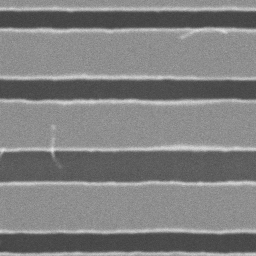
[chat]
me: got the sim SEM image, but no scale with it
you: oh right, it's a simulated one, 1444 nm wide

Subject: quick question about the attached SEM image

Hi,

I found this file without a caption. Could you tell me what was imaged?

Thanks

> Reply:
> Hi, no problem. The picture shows lines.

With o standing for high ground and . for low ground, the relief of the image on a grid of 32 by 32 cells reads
oooooooooooooooooooooooooooooooo
................................
................................
....oo.................o.ooooo..
oooooooooooooooooooooooooooooooo
oooooooooooooooooooooooooooooooo
oooooooooooooooooooooooooooooooo
oooooooooooooooooooooooooooooooo
oooooooooooooooooooooooooooooooo
oooooooooooooooooooooooooooooooo
................................
................................
ooo..........ooooo......oooooo..
oooooooooooooooooooooooooooooooo
oooooooooooooooooooooooooooooooo
oooooooooooooooooooooooooooooooo
oooooooooooooooooooooooooooooooo
oooooooooooooooooooooooooooooooo
oooooooooooooooooooooooooooooooo
................................
................................
................................
................................
oooooooooooooooooooooooooooooooo
oooooooooooooooooooooooooooooooo
oooooooooooooooooooooooooooooooo
oooooooooooooooooooooooooooooooo
oooooooooooooooooooooooooooooooo
oooooooooooooooooooooooooooooooo
................................
................................
................................